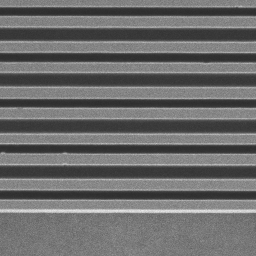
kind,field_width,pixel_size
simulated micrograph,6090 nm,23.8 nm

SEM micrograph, parallel lines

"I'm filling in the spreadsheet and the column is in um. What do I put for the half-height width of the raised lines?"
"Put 0.309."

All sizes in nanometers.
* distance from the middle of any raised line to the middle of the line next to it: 545